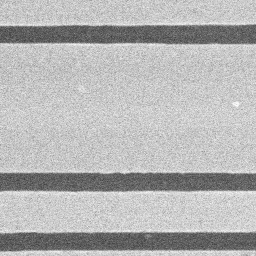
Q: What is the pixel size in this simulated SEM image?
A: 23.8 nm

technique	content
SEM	lines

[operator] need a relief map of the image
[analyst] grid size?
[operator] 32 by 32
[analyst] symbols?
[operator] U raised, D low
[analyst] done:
UUUUUUUUUUUUUUUUUUUUUUUUUUUUUUUU
UUUUUUUUUUUUUUUUUUUUUUUUUUUUUUUU
UUUUUUUUUUUUUUUUUUUUUUUUUUUUUUUU
DDDDDDDDDDDDDDDDDDDDDDDDDDDDDDDD
DDDDDDDDDDDDDDDDDDDDDDDDDDDDDDDD
DDDDDDDDDDDDDDDDDDDDDDDDDDDDDDDD
UUUUUUUUUUUUUUUUUUUUUUUUUUUUUUUU
UUUUUUUUUUUUUUUUUUUUUUUUUUUUUUUU
UUUUUUUUUUUUUUUUUUUUUUUUUUUUUUUU
UUUUUUUUUUUUUUUUUUUUUUUUUUUUUUUU
UUUUUUUUUUUUUUUUUUUUUUUUUUUUUUUU
UUUUUUUUUUUUUUUUUUUUUUUUUUUUUUUU
UUUUUUUUUUUUUUUUUUUUUUUUUUUUUUUU
UUUUUUUUUUUUUUUUUUUUUUUUUUUUUUUU
UUUUUUUUUUUUUUUUUUUUUUUUUUUUUUUU
UUUUUUUUUUUUUUUUUUUUUUUUUUUUUUUU
UUUUUUUUUUUUUUUUUUUUUUUUUUUUUUUU
UUUUUUUUUUUUUUUUUUUUUUUUUUUUUUUU
UUUUUUUUUUUUUUUUUUUUUUUUUUUUUUUU
UUUUUUUUUUUUUUUUUUUUUUUUUUUUUUUU
UUUUUUUUUUUUUUUUUUUUUUUUUUUUUUUU
UUUUUUUUUUUUUUUUUUUUUUUUUUUUUUUU
DDDDDDDDDDDDDDDDDDDDDDDDDDDDDDDD
DDDDDDDDDDDDDDDDDDDDDDDDDDDDDDDD
UUUUUUUUUUUUUUUUUUUUUUUUUUUUUUUU
UUUUUUUUUUUUUUUUUUUUUUUUUUUUUUUU
UUUUUUUUUUUUUUUUUUUUUUUUUUUUUUUU
UUUUUUUUUUUUUUUUUUUUUUUUUUUUUUUU
UUUUUUUUUUUUUUUUUUUUUUUUUUUUUUUU
DDDDDDDDDDDDDDDDDDDDDDDDDDDDDDDD
DDDDDDDDDDDDDDDDDDDDDDDDDDDDDDDD
DDUUUUUUUUUUUUUUUUUUUUUUUUUUUUUU